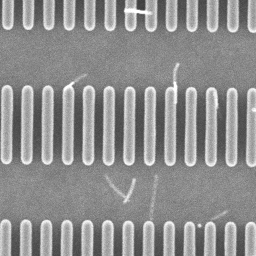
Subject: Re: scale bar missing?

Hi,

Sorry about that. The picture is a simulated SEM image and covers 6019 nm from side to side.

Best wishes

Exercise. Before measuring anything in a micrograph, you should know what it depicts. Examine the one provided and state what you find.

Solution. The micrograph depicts groups of lines, slits or small figures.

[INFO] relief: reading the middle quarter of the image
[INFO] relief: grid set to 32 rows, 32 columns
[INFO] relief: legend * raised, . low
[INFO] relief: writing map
................................
................................
................................
................................
................................
.*..............................
**...***..**...***..***...**...*
**...***..**...***..***...**...*
**...***..**...***..***...**...*
**...***..**...***..***...**...*
**...**...**...***..***...**...*
**...**...**...***..***..***...*
**...**...**...**...***..***...*
**...**...**...**...***..***...*
**...**...**...**...***..***...*
**...**...**...**...***..***...*
**...**...**...**...***..***..**
**...**...**...**...***..***..**
**...**...**...**...***..***..**
**...**...**...**...***..***..**
**...**...**...**...***..***..**
**...**...**...**...***..***..**
**...**...**...**...***..***..**
**...**...**...**...***..***..**
**...**...**...**...**...***..**
................................
................................
................................
................................
................................
................................
................................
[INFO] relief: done